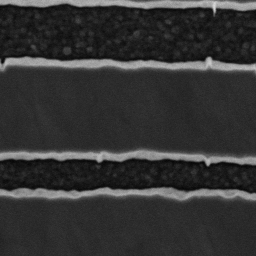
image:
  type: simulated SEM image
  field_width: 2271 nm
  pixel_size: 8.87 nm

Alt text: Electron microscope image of one or a few lines or trenches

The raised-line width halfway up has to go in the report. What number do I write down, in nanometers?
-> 830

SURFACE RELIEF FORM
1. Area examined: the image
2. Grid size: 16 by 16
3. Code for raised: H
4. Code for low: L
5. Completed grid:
LLLLLLLLLLLLLLLL
LLLLLLLLLLLLLLLL
LLLLLLLLLLLLLLLL
LLLLLLLLLLLLLLLL
HHHHHHHHHHHHHHHH
HHHHHHHHHHHHHHHH
HHHHHHHHHHHHHHHH
HHHHHHHHHHHHHHHH
HHHHHHHHHHHHHHHH
HHHHHHHHHHHHHHHH
LLLLLLLLLLLLLLLL
LLLLLLLLLLLLLLLL
HHHHHHHHHHHHHHHH
HHHHHHHHHHHHHHHH
HHHHHHHHHHHHHHHH
HHHHHHHHHHHHHHHH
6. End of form